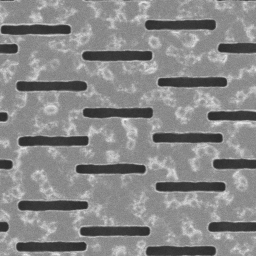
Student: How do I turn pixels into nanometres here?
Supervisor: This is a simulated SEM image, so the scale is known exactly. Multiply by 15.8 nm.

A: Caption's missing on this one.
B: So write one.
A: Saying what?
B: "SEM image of a regular array of holes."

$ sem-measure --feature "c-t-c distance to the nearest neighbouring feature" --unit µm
0.877